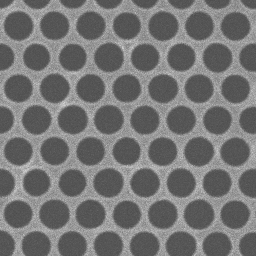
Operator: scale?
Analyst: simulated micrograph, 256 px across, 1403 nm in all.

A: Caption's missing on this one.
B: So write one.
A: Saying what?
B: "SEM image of a regular array of holes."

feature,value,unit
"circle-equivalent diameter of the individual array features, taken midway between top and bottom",159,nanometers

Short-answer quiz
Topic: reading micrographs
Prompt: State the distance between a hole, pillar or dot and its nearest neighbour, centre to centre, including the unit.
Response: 196 nm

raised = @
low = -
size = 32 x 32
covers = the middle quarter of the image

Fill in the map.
-----@@@------@@@------@@@------
@---@@@@@----@@@@@@---@@@@@----@
@@@@@@-@@@@@@@@@@@@@@@@@@@@@@@@@
@@@@-----@@@@-----@@@@-----@@@@-
-@@-------@@-------@@-------@@@-
-@@-------@@-------@@-------@@--
-@@-------@@-------@@--------@--
-@@-------@@-------@@-------@@--
@@@@-----@@@@-----@@@@------@@@-
@@@@@@--@@@@@@---@@@@@@----@@@@@
@--@@@@@@@---@@@@@@--@@@@@@@--@@
-----@@@------@@@@-----@@@@-----
------@@-------@@-------@@------
------@--------@@-------@@------
------@--------@@-------@@------
------@@-------@@-------@@------
-----@@@@-----@@@@-----@@@@-----
@--@@@@@@@--@@@@@@@--@@@@@@@--@@
@@@@@---@@@@@@@--@@@@@@@--@@@@@@
@@@@-----@@@@-----@@@@-----@@@@-
-@@-------@@-------@@-------@@--
-@@-------@@-------@@-------@@--
-@@-------@@-------@@-------@@--
-@@-------@@-------@@-------@@--
@@@@-----@@@@-----@@@@-----@@@@-
@@@@@@@@@@@@@@@@@@@@@@@@@@@@@@@@
@--@@@@@@----@@@@@@---@@@@@----@
-----@@@------@@@@-----@@@------
-----@@@-------@@-------@@------
------@--------@@-------@@------
------@--------@@-------@@------
-----@@@-------@@-------@@------